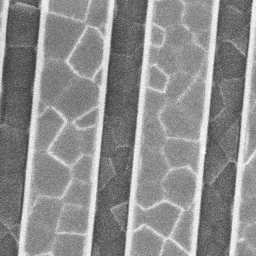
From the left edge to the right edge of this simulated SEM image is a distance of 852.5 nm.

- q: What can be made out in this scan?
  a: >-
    one or a few lines or trenches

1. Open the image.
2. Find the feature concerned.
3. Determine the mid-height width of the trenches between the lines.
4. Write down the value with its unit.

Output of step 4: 0.126 µm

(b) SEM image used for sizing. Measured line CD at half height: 0.223 micrometres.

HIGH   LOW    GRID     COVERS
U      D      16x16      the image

DDDUUUUDDUUUUUDD
DDDUUUUDDUUUUDDD
DDDUUUUDDUUUUDDD
DDUUUUUDDUUUUDDD
DDUUUUUDDUUUUDDD
DDUUUUUDDUUUUDDU
DDUUUUDDDUUUUDDU
DDUUUUDDDUUUUDDU
DDUUUUDDDUUUUDDU
DDUUUUDDDUUUUDDU
DDUUUUDDUUUUUDDU
DDUUUUDDUUUUDDDU
DDUUUUDDUUUUDDDU
DUUUUUDDUUUUDDDU
DUUUUUDDUUUUDDDU
DUUUUUDDUUUUDDDU